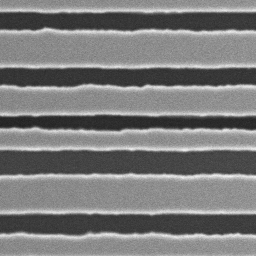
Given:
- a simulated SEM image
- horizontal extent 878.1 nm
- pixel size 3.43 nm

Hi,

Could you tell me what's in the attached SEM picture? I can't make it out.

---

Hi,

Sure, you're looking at lines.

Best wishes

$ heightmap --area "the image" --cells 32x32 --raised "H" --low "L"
HHHHHHHHHHHHHHHHHHHHHHHHHHHHHHHH
LLLLLLLLLLLLLLLLLLLLLLLLLLLLLLLL
LLLLLLLLLLLLLLLLLLLLLLLLLLLLLLLL
LLLLLLLLLLLLLLLLLLLLLLLLLLLLLLLL
HHHHHHHHHHHHHHHHHHHHHHHHHHHHHHHH
HHHHHHHHHHHHHHHHHHHHHHHHHHHHHHHH
HHHHHHHHHHHHHHHHHHHHHHHHHHHHHHHH
HHHHHHHHHHHHHHHHHHHHHHHHHHHHHHHH
LLLLLLLLLLLLLLLLHLLLLLLLLLLLLLLL
LLLLLLLLLLLLLLLLLLLLLLLLLLLLLLLL
LLLLLLLLLLLLLLLLLLLLLLLLLLLLLLLL
HHHHHHHHHHHHHHHHHHHHHHHHHHHHHHHH
HHHHHHHHHHHHHHHHHHHHHHHHHHHHHHHH
HHHHHHHHHHHHHHHHHHHHHHHHHHHHHHHH
LLLLLLLLLLLLLLLLLLLLLLLLLLLLLLLL
LLLLLLLLLLLLLLLLLLLLLLLLLLLLLLLL
HHHHHHHHHHHHHHHHHHHHHHHHHHHHHHHH
HHHHHHHHHHHHHHHHHHHHHHHHHHHHHHHH
HHHHHHHHHHHHHHHHHHHHHHHHHHHHHHHH
LLLLLLLLLLLLLLLLLLLLLLLLLLLLLLLL
LLLLLLLLLLLLLLLLLLLLLLLLLLLLLLLL
LLLLLLLLLLLLLLLLLLLLLLLLLLLLLLLL
HHHHHHHHHHHHHHHHHHHHHHHHHHHHHHHH
HHHHHHHHHHHHHHHHHHHHHHHHHHHHHHHH
HHHHHHHHHHHHHHHHHHHHHHHHHHHHHHHH
HHHHHHHHHHHHHHHHHHHHHHHHHHHHHHHH
HHHHHHHHHHHHHHHHHHHHHHHHHHHHHHHH
LLLLLLLLLLLLLLLLLLLLLLLLLLLLLLLL
LLLLLLLLLLLLLLLLLLLLLLLLLLLLLLLL
HHHHHHHHLLLHHHHHHHHHHHLHHHHHHHHH
HHHHHHHHHHHHHHHHHHHHHHHHHHHHHHHH
HHHHHHHHHHHHHHHHHHHHHHHHHHHHHHHH